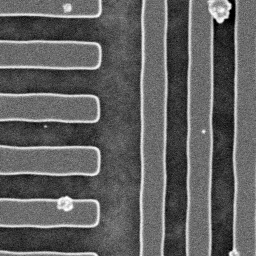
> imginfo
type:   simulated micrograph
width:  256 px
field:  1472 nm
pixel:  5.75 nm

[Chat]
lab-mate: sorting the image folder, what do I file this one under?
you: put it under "groups of lines, slits or small figures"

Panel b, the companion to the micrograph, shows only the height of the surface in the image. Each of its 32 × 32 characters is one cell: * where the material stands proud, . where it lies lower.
*************.....***...*****.**
*************.....***...*****.**
..................***...****.***
..................***...***..***
..................***...***..***
************......***...***..***
*************.....***...***..***
*************.....***...***..***
.....*******......***...***..***
..................***...***..***
..................***...***..***
..................***...***..***
************......***...***..***
************......***...***..***
************......***...**...***
..................***...**...***
..................***...**...***
..................***..****..***
************......***..****..***
************......***..***...***
************......***...**...***
************......***..***...***
..................***..***...***
..................***..***...***
..................***..***...***
************......**...***...***
************......**...***...***
************......**...***...***
..................**...***...***
..................**...***...***
..................**...***...***
**...*............**...***...***